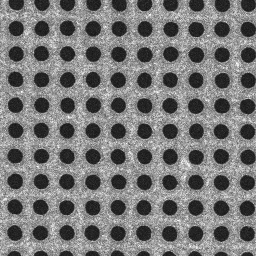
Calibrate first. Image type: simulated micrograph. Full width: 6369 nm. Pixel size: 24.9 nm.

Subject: a regular array of holes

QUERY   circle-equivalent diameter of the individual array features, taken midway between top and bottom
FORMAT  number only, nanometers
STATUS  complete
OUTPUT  387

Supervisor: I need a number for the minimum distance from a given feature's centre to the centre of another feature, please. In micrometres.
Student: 0.63